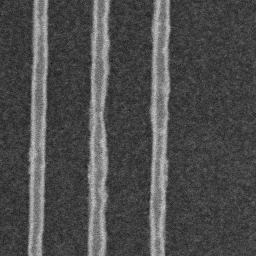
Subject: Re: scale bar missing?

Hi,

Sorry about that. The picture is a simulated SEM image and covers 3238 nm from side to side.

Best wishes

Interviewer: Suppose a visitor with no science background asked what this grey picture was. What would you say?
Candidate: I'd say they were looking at one or a few lines or trenches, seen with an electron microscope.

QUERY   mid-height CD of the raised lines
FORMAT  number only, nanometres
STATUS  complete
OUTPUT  134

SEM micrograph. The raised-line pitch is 0.765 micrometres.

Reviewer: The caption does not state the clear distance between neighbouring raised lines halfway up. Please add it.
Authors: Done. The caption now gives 631 nm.